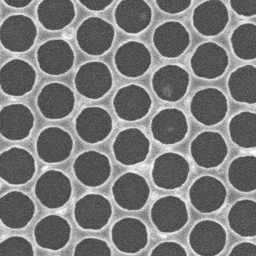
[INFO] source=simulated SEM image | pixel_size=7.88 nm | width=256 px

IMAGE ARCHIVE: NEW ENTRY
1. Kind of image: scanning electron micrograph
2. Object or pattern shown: a regular array of holes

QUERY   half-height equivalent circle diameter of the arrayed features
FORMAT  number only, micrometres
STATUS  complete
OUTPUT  0.293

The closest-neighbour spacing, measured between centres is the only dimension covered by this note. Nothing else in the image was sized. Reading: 342 nm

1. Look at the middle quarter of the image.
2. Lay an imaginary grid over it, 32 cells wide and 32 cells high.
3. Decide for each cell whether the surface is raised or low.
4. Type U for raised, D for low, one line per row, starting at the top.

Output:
DDUUDDDDDDDUUDDDDDDDDUUUUDDDUUUU
DUUUDDDDDDDUUDDDDDDDDUUDDDDDDDUU
UUUDDDDDDDDDUUDDDDDDUUDDDDDDDDDU
UUUDDDDDDDDDUUUUUUUUUUDDDDDDDDDU
UUUDDDDDDDDDUUUUUUUUUUDDDDDDDDDU
DUUDDDDDDDDDUUUUDDDUUUDDDDDDDDDU
DDUDDDDDDDDUUUDDDDDDDUDDDDDDDDDU
DDUUDDDDDDUUUDDDDDDDDUUDDDDDDDUU
DDDUUUDDDUUUDDDDDDDDDDUUDDDDDUUU
DDDUUUUUUUUUDDDDDDDDDDUUUUDUUUUU
DDDUUUUUUUUUDDDDDDDDDDUUUUUUUUUU
DDUUUDDDDDUUUDDDDDDDDUUUDDDDDUUD
DUUUDDDDDDDUUDDDDDDDDUUDDDDDDDUU
UUUDDDDDDDDDUUDDDDDDUUDDDDDDDDUU
UUUDDDDDDDDDUUUUUUUUUUDDDDDDDDDU
UUUDDDDDDDDDUUUUUUUUUUDDDDDDDDDU
UUUDDDDDDDDDUUUDDDDUUUDDDDDDDDDU
DUUDDDDDDDDUUUDDDDDDUUDDDDDDDDDU
DDUUDDDDDDDUUDDDDDDDDUDDDDDDDDUU
DDUUUDDDDUUUDDDDDDDDDDUUDDDDDUUU
DDUUUUUUUUUUDDDDDDDDDDUUUUUUUUUU
DDUUUUUUUUUUDDDDDDDDDUUUUUUUUUUD
DDUUDDDDDDUUDDDDDDDDDUUUUDDDUUUU
DUUDDDDDDDDUUDDDDDDDDUUDDDDDDDUU
UUUDDDDDDDDUUUDDDDDDUUDDDDDDDDDU
UUDDDDDDDDDDUUUUDUUUUUDDDDDDDDDU
UUDDDDDDDDDDUUUUUUUUUUDDDDDDDDDU
UUUDDDDDDDDDUUUDDDUUUUDDDDDDDDDU
DUUDDDDDDDDUUUDDDDDDUUDDDDDDDDDU
DDUUDDDDDDUUUDDDDDDDDUDDDDDDDDUU
DDUUUUDDDUUUDDDDDDDDDUUDDDDDDUUU
DDUUUUUUUUUUDDDDDDDDDUUUUUUUUUUD